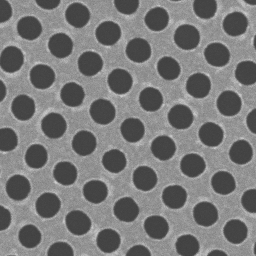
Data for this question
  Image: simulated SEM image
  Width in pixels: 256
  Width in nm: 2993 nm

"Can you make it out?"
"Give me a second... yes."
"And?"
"a regular array of holes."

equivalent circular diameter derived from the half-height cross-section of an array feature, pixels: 25.4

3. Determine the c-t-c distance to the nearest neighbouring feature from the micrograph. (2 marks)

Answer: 406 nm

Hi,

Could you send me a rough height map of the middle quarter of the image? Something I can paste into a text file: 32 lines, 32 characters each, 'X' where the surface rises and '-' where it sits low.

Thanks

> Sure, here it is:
XXX-------XXXXXXXXXXXXX------XXX
XXXX-----XXX----XXXXXXX------XXX
XXXX----XXX-----XXXXXXXX-----XXX
XXXXXXXXXXX------XXXXXXXX---XXX-
X-XXXXXXXXX------XXXXXXXXXXXXXX-
----XXXXXXX------XXXXXXXXXXXXX--
-----XXXXXXX-----XX-----XXXXXXX-
-----XXXXXXXX--XXXX-----XXXXXXX-
-----XXXXXXXXXXXXXX------XXXXXXX
-----XX-----XXXXXXX------XXXXXXX
X---XXX------XXXXXX-----XXX----X
XXXXXX-------XXXXXXX---XXX------
XXXXXX-------XXXXXXXXXXXXX------
XXXXXXX------XXX--XXXXXXXX------
XXXXXXXX----XXX-----XXXXXX------
-XXXXXXXXXXXXX------XXXXXXX-----
-XXXXXXXXXXXXX------XXXXXXXXXXXX
XXX----XXXXXXX------XXXXXXXXXXXX
XX------XXXXXXX-----XXX----XXXXX
XX------XXXXXXXX--XXXX-----XXXXX
XX------XXXXXXXXXXXXXX------XXXX
XX------XXX---XXXXXXXX------XXXX
XXX----XXX-----XXXXXXX------XXX-
XXXXXXXXX-------XXXXXXX----XX---
-XXXXXXXX-------XXXXXXXXXXXXX---
---XXXXXXX------XXX-XXXXXXXXX---
---XXXXXXXX----XXX----XXXXXXX---
---XXXXXXXXXXXXXX------XXXXXXX--
---XXXXXXXXXXXXXX------XXXXXXXXX
---XXX----XXXXXXX------XXXXXXXXX
XXXXX------XXXXXXX-----XXX---XXX
XXXXX------XXXXXXXX---XXX-----XX